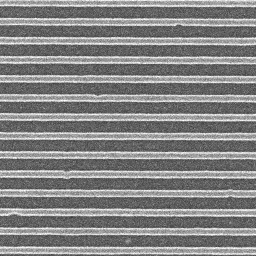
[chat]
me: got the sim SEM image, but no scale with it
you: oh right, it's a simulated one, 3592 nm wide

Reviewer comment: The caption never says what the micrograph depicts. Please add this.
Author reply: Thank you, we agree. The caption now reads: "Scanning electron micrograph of parallel lines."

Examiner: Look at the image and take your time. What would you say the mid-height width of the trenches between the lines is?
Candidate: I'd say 12.5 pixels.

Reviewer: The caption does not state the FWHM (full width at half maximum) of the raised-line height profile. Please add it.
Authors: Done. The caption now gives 87.7 nm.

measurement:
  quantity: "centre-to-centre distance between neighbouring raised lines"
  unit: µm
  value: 0.267